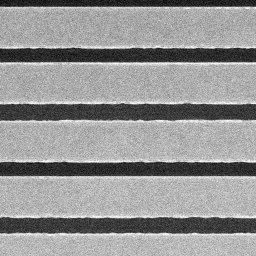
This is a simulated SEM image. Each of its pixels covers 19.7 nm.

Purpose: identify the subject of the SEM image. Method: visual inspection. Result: lines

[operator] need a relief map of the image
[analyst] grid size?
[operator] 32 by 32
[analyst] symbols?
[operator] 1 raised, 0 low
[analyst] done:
00000000000000000000000000000000
11111111111111111111111111111111
11111111111111111111111111111111
11111111111111111111111111111111
11111111111111111111111111111111
11111111111111111111111111111111
00000000000000000000000000000000
00000000000000000000000000000000
11111111111111111111111111111111
11111111111111111111111111111111
11111111111111111111111111111111
11111111111111111111111111111111
11111111111111111111111111111111
00000000000000000000000000000000
00000000000000000000000000000000
11111111111111111111111111111111
11111111111111111111111111111111
11111111111111111111111111111111
11111111111111111111111111111111
11111111111111111111111111111111
00000000000000000000000000000000
00000000000000000000000000000000
11111111111111111111111111111111
11111111111111111111111111111111
11111111111111111111111111111111
11111111111111111111111111111111
11111111111111111111111111111111
00000000000000000000000000000000
00000000000000000000000000000000
11111111111111111111111111111111
11111111111111111111111111111111
11111111111111111111111111111111